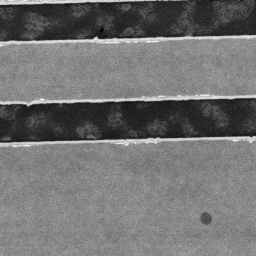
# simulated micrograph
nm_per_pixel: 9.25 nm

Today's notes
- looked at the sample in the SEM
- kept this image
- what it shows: one or a few lines or trenches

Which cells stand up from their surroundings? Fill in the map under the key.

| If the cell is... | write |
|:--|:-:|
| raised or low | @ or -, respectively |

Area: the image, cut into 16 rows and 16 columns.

----------------
----------------
-------@@@@@@@@@
@@@@@@@@@@@@@@@@
@@@@@@@@@@@@@@@@
@@@@@@@@@@@@@@@@
----------------
----------------
----------------
@@@@@@@@@@@@@@@@
@@@@@@@@@@@@@@@@
@@@@@@@@@@@@@@@@
@@@@@@@@@@@@@@@@
@@@@@@@@@@@@@@@@
@@@@@@@@@@@@@@@@
@@@@@@@@@@@@@@@@